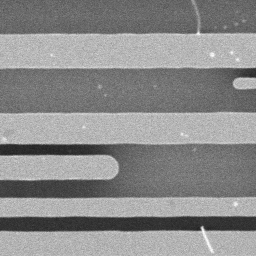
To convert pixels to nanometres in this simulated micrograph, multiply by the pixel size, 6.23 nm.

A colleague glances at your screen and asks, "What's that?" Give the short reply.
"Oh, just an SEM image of groups of lines, slits or small figures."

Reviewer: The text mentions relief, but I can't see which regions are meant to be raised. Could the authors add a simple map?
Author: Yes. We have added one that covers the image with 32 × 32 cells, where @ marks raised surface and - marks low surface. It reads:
--------------------------------
--------------------------------
--------------------------------
--------------------------------
@@@@@@@@@@@@@@@@@@@@@@@@@@@@@@@@
@@@@@@@@@@@@@@@@@@@@@@@@@@@@@@@@
@@@@@@@@@@@@@@@@@@@@@@@@@@@@@@@@
@@@@@@@@@@@@@@@@@@@@@@@@@@@@@@@@
--------------------------------
--------------------------------
-----------------------------@@@
--------------------------------
--------------------------------
--------------------------------
@@@@@@@@@@@@@@@@@@@@@@@@@@@@@@@@
@@@@@@@@@@@@@@@@@@@@@@@@@@@@@@@@
@@@@@@@@@@@@@@@@@@@@@@@@@@@@@@@@
@@@@@@@@@@@@@@@@@@@@@@@@@@@@@@@@
--------------------------------
--------------------------------
@@@@@@@@@@@@@@@-----------------
@@@@@@@@@@@@@@@-----------------
--------------------------------
--------------------------------
--------------------------------
@@@@@@@@@@@@@@@@@@@@@@@@@@@@@@@@
@@@@@@@@@@@@@@@@@@@@@@@@@@@@@@@@
--------------------------------
--------------------------------
@@@@@@@@@@@@@@@@@@@@@@@@@@@@@@@@
@@@@@@@@@@@@@@@@@@@@@@@@@@@@@@@@
@@@@@@@@@@@@@@@@@@@@@@@@@@@@@@@@